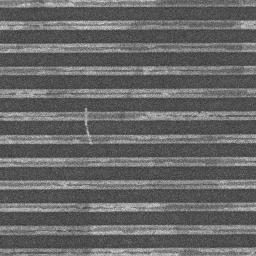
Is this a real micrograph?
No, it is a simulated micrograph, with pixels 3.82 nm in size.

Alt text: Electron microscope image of parallel lines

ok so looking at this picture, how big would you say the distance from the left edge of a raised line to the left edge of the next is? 87.1 nanometers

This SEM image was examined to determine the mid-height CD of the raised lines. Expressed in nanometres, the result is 29.2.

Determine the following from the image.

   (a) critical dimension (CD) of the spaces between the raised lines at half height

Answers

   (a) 58.3 nanometres